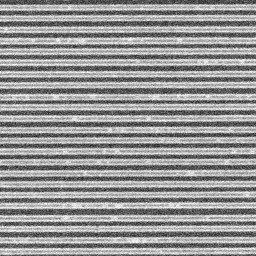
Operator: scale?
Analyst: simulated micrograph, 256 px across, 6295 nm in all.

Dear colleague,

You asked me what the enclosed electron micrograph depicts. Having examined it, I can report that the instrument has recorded parallel lines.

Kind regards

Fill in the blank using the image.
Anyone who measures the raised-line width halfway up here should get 0.108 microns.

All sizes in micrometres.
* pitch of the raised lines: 0.272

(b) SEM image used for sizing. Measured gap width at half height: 151 nm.